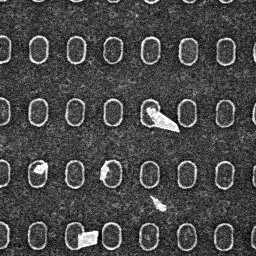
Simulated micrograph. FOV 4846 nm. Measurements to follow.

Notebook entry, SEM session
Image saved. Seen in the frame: a regular array of raised bodies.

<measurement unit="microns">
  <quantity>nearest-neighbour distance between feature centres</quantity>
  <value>0.702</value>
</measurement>